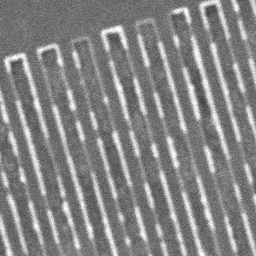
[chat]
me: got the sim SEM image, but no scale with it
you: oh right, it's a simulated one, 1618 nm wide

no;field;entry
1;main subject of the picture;parallel lines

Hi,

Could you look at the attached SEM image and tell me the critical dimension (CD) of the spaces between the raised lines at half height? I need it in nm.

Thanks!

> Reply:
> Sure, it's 89.6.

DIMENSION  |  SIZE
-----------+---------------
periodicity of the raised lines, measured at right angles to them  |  33.6 px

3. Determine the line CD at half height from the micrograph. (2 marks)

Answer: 119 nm